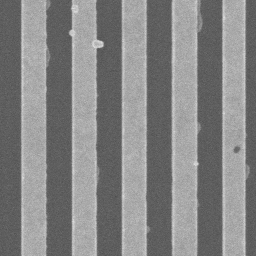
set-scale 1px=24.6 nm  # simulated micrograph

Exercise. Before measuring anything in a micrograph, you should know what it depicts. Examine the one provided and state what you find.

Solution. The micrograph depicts lines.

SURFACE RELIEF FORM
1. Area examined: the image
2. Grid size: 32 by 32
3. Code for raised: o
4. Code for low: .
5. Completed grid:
...ooo...ooo...ooo....ooo...ooo.
...ooo...ooo...ooo....ooo...ooo.
...ooo...ooo...ooo....ooo...ooo.
...ooo...ooo...ooo....ooo...ooo.
...ooo...ooo...ooo....ooo...ooo.
...ooo...oooo..ooo....ooo...ooo.
...ooo...ooo...ooo....ooo...ooo.
...ooo...ooo...ooo....ooo...ooo.
...ooo...ooo...ooo....ooo...ooo.
...ooo...ooo...ooo....ooo...ooo.
...ooo...ooo...ooo....ooo...ooo.
...ooo...ooo...ooo....ooo...ooo.
...ooo...ooo...ooo....ooo...ooo.
...ooo...ooo...ooo....ooo...ooo.
...ooo...ooo...ooo....ooo...ooo.
...ooo...ooo...ooo....ooo...ooo.
...ooo...ooo...ooo....ooo...ooo.
...ooo...ooo...ooo....ooo...ooo.
...ooo...ooo...ooo....ooo...ooo.
...ooo...ooo...ooo....ooo...ooo.
...ooo...ooo...ooo....ooo...ooo.
...ooo...ooo...ooo....ooo...ooo.
...ooo...ooo...ooo....ooo...ooo.
...ooo...ooo...ooo....ooo...ooo.
...ooo...ooo...ooo....ooo...ooo.
...ooo...ooo...ooo....ooo...ooo.
...ooo...ooo...ooo....ooo...ooo.
...ooo...ooo...ooo....ooo...ooo.
...ooo...ooo...ooo....ooo...ooo.
...ooo...ooo...ooo....ooo...ooo.
...ooo...ooo...ooo....ooo...ooo.
...ooo...ooo...ooo....ooo...ooo.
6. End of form